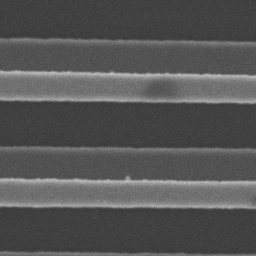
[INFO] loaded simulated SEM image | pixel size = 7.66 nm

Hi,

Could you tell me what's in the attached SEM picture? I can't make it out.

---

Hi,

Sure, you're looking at lines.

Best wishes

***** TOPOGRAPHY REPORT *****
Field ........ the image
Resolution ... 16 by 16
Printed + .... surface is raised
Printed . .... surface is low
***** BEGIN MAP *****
................
................
+++++...........
++++++++++++++++
++++++++++++++++
++++++++++++++++
................
................
................
++++++++++++++++
++++++++++++++++
++++++++++++++++
++++++++++++++++
................
................
................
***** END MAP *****